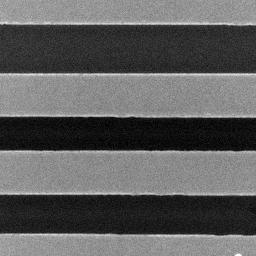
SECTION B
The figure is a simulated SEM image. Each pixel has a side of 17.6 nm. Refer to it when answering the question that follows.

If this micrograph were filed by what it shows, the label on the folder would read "lines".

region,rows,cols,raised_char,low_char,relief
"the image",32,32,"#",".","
################################
################################
################################
................................
................................
................................
................................
................................
................................
################################
################################
################################
################################
################################
################################
................................
................................
................................
................................
################################
################################
################################
################################
################################
................................
................................
................................
................................
................................
###########################.###.
################################
################################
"